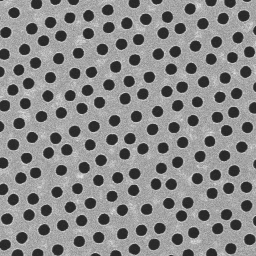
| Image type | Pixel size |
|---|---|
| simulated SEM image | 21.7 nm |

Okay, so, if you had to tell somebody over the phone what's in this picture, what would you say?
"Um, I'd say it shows a regular array of holes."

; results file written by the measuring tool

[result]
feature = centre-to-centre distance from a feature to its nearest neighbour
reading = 0.387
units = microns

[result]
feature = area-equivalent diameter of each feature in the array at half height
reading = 250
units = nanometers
